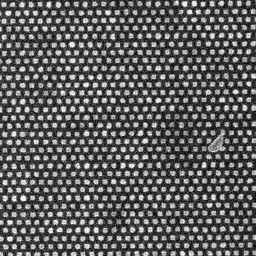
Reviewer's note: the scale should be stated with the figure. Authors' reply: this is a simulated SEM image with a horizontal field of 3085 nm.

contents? a regular array of raised bodies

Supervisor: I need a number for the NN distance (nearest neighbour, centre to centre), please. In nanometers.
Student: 104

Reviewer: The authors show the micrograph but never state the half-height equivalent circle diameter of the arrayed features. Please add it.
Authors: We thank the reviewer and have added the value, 52.7 nanometers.